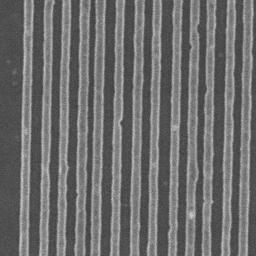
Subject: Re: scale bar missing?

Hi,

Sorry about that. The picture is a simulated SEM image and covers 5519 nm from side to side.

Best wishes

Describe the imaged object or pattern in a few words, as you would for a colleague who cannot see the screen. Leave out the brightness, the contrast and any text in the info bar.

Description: parallel lines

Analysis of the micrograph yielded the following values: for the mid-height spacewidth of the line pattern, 234 nm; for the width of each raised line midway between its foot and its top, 0.17 microns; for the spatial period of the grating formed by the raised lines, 394 nm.